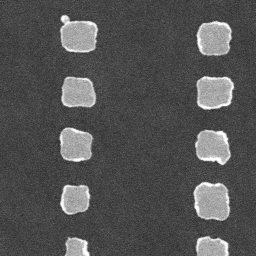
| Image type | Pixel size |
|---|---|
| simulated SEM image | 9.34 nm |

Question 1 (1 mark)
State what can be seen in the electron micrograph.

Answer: a regular array of raised bodies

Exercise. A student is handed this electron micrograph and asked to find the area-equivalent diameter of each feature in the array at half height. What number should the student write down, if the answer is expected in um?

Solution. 0.319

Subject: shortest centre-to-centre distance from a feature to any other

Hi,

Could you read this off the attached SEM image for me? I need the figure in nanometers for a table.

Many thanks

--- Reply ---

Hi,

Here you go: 505